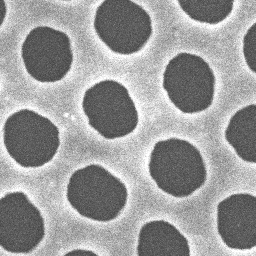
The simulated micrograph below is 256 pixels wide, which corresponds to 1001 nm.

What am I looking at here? holes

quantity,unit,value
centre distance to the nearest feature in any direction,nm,329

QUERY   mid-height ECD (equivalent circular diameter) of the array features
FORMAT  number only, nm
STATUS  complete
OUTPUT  220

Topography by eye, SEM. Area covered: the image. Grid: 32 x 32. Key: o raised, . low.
.oooooooooooo....ooooo.......ooo
.ooooooooooo......ooooo......ooo
.ooooooooooo.......ooooo....oooo
oooo...ooooo.......oooooooooooo.
ooo.....oooo.......oooooooooooo.
ooo......oooo.....oooooooooooo..
ooo......ooooo...ooooooooooooo..
ooo......oooooooooooo....oooooo.
ooo......oooooooooooo.....ooooo.
oooo....oooooooooooo.......ooooo
oooooooooooo...ooooo.......ooooo
ooooooooooo.....ooooo......ooooo
oooooooooo.......oooo......ooooo
oooooooooo.......ooooo....oooo..
o....oooooo......oooooooooooo...
o......oooo......oooooooooooo...
.......ooooo....oooooooooooo....
.......ooooooooooooo...ooooo....
o......oooooooooooo......oooo...
o......oooooooooooo......ooooo..
oo....ooooooooooooo.......oooooo
ooooooooo.....ooooo.......oooooo
ooooooooo......oooo.......oooooo
oooooooo........oooo.....ooooooo
...ooooo........oooooo..ooooo...
....ooooo.......ooooooooooo.....
.....ooooo.....oooooooooooo.....
.....ooooooo..ooooooooooooo.....
......oooooooooooo....ooooo.....
.....oooooooooooo......ooooo....
.....oooooooooooo.......oooo....
o...ooooo...ooooo.......oooooooo